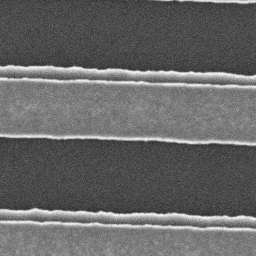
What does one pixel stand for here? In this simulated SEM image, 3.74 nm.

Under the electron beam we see lines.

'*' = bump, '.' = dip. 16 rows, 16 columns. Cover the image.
................
................
................
................
*********.......
****************
****************
****************
****************
................
................
................
................
************....
****************
****************